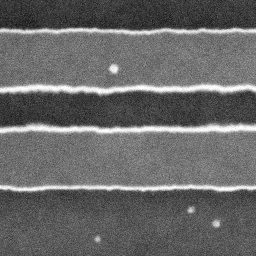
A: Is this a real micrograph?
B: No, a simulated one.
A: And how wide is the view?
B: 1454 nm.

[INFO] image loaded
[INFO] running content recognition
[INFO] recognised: lines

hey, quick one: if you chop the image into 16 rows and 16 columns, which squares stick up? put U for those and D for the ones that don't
DDDDDDDDDDDDDDDD
DDDDDDDDDDDDDDDD
UUUUUUUUUUUUUUUU
UUUUUUUUUUUUUUUU
UUUUUUUUUUUUUUUU
UUDUUUUUUUUUDUUD
DDDDDDDDDDDDDDDD
DDDDDDDDDDDDDDDD
UUUUUUUUUUUUUUUU
UUUUUUUUUUUUUUUU
UUUUUUUUUUUUUUUU
UUUUUUUUUUUUUUUU
DDDDDDDDDDDDDDDD
DDDDDDDDDDDDDDDD
DDDDDDDDDDDDDDDD
DDDDDDDDDDDDDDDD